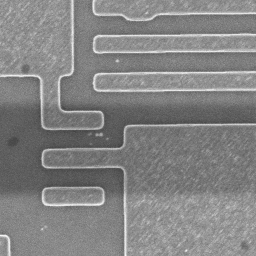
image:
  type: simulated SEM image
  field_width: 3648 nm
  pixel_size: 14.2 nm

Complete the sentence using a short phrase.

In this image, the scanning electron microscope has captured wiring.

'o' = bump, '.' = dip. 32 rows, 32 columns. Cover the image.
ooooooooo...oooooooooooooooooooo
ooooooooo...oooooooooooooooooooo
ooooooooo.......ooo.............
ooooooooo.......................
ooooooooo...oooooooooooooooooooo
ooooooooo...oooooooooooooooooooo
ooooooooo...ooooooooo...........
ooooooooo.......................
ooooooooo.......................
o.o.oooo....oooooooooooooooooooo
.....oo.....oooooooooooooooooooo
.....oo.........................
.....oo.........................
.....ooo........................
.....oooooooo...................
.....oooooooo...................
................oooooooooooooooo
...............ooooooooooooooooo
...............ooooooooooooooooo
.....ooooooooooooooooooooooooooo
.....ooooooooooooooooooooooooooo
...............ooooooooooooooooo
................oooooooooooooooo
......oooooo....oooooooooooooooo
.....oooooooo...oooooooooooooooo
......ooooooo...oooooooooooooooo
................oooooooooooooooo
................oooooooooooooooo
................oooooooooooooooo
o...............oooooooooooooooo
o...............oooooooooooooooo
o...............oooooooooooooooo